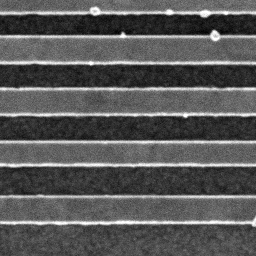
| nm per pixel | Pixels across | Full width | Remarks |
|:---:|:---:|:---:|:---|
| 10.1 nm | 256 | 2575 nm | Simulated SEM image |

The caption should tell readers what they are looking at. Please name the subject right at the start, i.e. lines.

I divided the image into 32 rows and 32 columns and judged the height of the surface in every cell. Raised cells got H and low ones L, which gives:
HHHHHHHHHHHHHHHHHHHHHHHHHHHHHHHH
HHHHHHHHHHHHHHHHHHHHHHHHHHHHHHHH
LLLLLLLLLLLLLLLLLLLLLLLLLLLLLLLL
LLLLLLLLLLLLLLLLLLLLLLLLLLLLLLLL
LLLLLLLLLLLLLLLHLLLLLLLLLLHHLLLL
HHHHHHHHHHHHHHHHHHHHHHHHHHHHHHHH
HHHHHHHHHHHHHHHHHHHHHHHHHHHHHHHH
HHHHHHHHHHHHHHHHHHHHHHHHHHHHHHHH
LLLLLLLLLLLLLLLLLLLLLLLLLLLLLLLL
LLLLLLLLLLLLLLLLLLLLLLLLLLLLLLLL
LLLLLLLLLLLLLLLLLLLLLLLLLLLLLLLL
HHHHHHHHHHHHHHHHHHHHHHHHHHHHHHHH
HHHHHHHHHHHHHHHHHHHHHHHHHHHHHHHH
HHHHHHHHHHHHHHHHHHHHHHHHHHHHHHHH
LLLLLLLLLLLLLLLLLLLLLLLHLLLLLLLL
LLLLLLLLLLLLLLLLLLLLLLLLLLLLLLLL
LLLLLLLLLLLLLLLLLLLLLLLLLLLLLLLL
LLLLLLLLLLLLLLLLLLLLLLLLLLLLLLLL
HHHHHHHHHHHHHHHHHHHHHHHHHHHHHHHH
HHHHHHHHHHHHHHHHHHHHHHHHHHHHHHHH
HHHHHHHHHHHHHHHHHHHHHHHHHHHHHHHH
LLLLLLLLLLLLLLLLLLLLLLLLLLLLLLLL
LLLLLLLLLLLLLLLLLLLLLLLLLLLLLLLL
LLLLLLLLLLLLLLLLLLLLLLLLLLLLLLLL
LLLLHLLLLLLLLHLLLLLLLLLLLLLLLLLL
HHHHHHHHHHHHHHHHHHHHHHHHHHHHHHHH
HHHHHHHHHHHHHHHHHHHHHHHHHHHHHHHH
HHHHHHHHHHHHHHHHHHHHHHHHHHHHHHHH
LLLLLLLLLLLLLLLLLLLLLLLLLLLLLLLL
LLLLLLLLLLLLLLLLLLLLLLLLLLLLLLLL
LLLLLLLLLLLLLLLLLLLLLLLLLLLLLLLL
LLLLLLLLLLLLLLLLLLLLLLLLLLLLLLLL